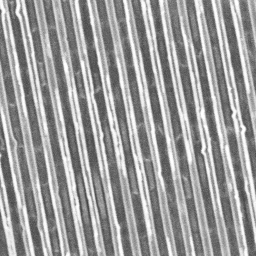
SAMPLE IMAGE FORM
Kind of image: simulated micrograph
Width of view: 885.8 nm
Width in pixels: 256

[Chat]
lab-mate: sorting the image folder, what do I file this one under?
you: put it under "parallel lines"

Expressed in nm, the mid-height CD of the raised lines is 25.6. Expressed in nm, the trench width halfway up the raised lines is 34.9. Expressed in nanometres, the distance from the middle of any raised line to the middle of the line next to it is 60.6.